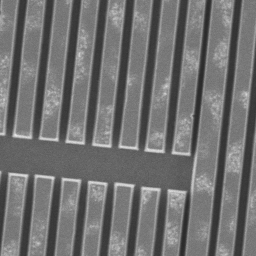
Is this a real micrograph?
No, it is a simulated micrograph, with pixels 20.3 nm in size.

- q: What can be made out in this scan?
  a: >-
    parallel lines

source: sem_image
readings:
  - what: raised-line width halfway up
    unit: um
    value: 0.354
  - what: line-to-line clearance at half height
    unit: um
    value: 0.195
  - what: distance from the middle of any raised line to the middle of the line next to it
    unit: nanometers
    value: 543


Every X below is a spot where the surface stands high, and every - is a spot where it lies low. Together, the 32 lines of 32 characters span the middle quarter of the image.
---XXXX--XXXXX--XXXX---XXXX---XX
---XXXX--XXXXX--XXXX---XXXX---XX
---XXXX--XXXX---XXXX---XXXX--XXX
---XXXX--XXXX---XXXX---XXXX--XXX
--XXXX---XXXX---XXXX--XXXXX--XXX
--XXXX---XXXX---XXXX--XXXXX--XXX
--XXXX---XXXX---XXXX--XXXX---XXX
--XXXX---XXXX---XXXX--XXXX---XXX
--XXXX---XXXX--XXXX---XXXX---XXX
--XXXX---XXXX--XXXX---XXXX---XXX
--XXXX--XXXXX--XXXX---XXXX---XXX
--XXXX--XXXXX--XXXX---XXXX--XXXX
-XXXXX--XXXX---XXXX---XXXX--XXXX
-XXXXX--XXXX---XXXX--XXXXX--XXXX
-XXXX---XXXX---XXXX--XXXXX--XXXX
-XXXX---XXXX--XXXXX--XXXX---XXXX
-XXXX---XXXX--XXXXX--XXXX---XXXX
-XXXX---XXXX--XXXX---XXXX---XXXX
-XXXX---XXXX--XXXX---XXXX---XXXX
--XXX--XXXXX--XXXX---XXXX---XXXX
--------------XXXX---XXXX---XXX-
---------------------XXXX--XXXXX
--------------------------------
--------------------------------
--------------------------------
--------------------------------
--------------------------------
--------------------------------
--------------------------------
XXXX----------------------------
XXXX--XXXXX--XXXX---------------
XXXX--XXXX---XXXX---XXX---------